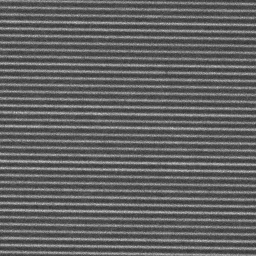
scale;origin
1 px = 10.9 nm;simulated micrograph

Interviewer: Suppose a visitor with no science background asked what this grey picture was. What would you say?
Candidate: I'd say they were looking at parallel lines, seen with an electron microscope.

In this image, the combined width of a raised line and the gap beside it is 0.0763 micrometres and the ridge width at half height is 0.0191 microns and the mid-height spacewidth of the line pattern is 55.9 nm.